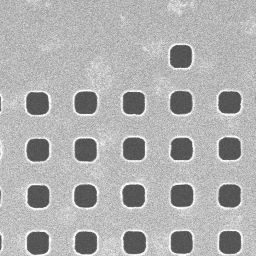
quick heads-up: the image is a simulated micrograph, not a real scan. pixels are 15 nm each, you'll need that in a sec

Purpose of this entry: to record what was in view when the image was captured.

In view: a regular array of holes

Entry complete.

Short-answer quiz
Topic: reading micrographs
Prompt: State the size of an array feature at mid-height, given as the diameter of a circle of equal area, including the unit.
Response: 24.5 px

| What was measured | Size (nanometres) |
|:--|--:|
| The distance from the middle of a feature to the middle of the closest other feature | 696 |